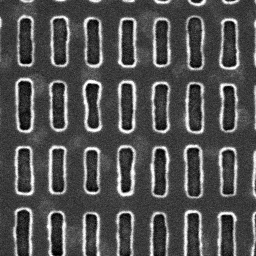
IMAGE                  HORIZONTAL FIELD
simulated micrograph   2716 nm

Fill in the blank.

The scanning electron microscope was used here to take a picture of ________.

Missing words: a regular array of holes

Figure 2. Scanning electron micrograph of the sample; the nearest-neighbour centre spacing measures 0.357 microns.